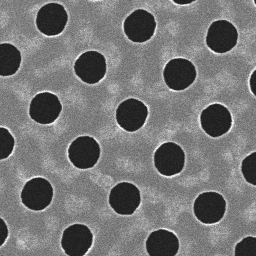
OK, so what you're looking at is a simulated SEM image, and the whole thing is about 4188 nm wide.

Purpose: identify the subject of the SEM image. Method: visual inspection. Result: a regular array of holes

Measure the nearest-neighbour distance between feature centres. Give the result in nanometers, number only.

966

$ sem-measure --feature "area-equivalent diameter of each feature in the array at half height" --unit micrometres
0.538